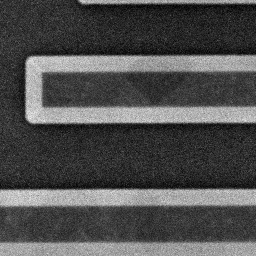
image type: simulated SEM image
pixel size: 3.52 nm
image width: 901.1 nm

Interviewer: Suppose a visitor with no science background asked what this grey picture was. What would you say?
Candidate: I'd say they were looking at one or a few lines or trenches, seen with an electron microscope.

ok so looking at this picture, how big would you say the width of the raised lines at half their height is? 187 nm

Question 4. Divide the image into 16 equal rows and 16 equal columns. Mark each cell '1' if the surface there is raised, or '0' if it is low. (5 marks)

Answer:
0000000000000000
0000000000000000
0000000000000000
0000000000000000
0011111111111111
0011111111111111
0011111111111111
0000000000000000
0000000000000000
0000000000000000
0000000000000000
0000000000000000
1111111111111111
1111111111111111
1111111111111111
1111111111111111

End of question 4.